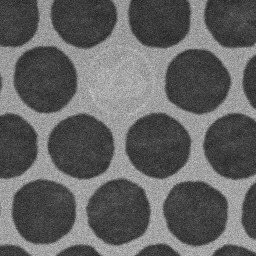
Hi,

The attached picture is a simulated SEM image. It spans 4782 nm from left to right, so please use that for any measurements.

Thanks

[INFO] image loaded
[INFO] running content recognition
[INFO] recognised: holes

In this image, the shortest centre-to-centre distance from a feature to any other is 1.4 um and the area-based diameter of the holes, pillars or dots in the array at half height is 1230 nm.